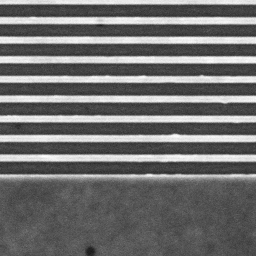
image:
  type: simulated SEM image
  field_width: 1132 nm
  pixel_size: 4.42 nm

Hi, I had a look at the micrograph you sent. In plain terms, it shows parallel lines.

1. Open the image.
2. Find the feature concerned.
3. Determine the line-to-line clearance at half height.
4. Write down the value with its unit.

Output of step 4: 0.0607 um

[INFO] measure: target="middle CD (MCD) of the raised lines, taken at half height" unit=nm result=26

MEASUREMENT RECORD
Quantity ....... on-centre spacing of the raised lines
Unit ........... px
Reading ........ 19.6